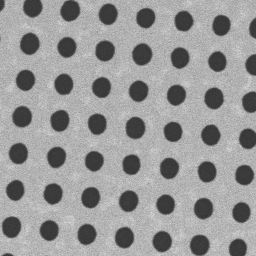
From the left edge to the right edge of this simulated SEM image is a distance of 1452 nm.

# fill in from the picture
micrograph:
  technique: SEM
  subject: a regular array of holes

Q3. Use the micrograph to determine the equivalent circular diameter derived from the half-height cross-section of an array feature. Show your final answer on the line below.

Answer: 110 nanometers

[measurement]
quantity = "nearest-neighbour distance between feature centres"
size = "36.7 pixels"